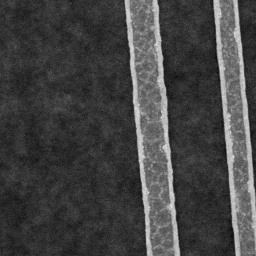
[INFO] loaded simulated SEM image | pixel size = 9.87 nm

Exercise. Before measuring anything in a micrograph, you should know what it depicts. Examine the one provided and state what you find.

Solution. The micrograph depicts one or a few lines or trenches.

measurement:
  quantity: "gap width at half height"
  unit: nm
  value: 591